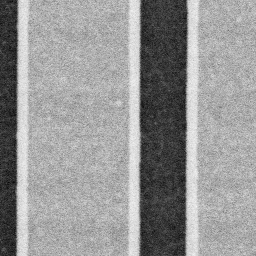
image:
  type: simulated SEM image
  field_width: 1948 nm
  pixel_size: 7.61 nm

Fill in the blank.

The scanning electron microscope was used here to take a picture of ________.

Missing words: one or a few lines or trenches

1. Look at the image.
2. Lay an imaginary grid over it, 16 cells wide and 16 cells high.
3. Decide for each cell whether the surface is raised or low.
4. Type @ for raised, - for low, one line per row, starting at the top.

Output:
--@@@@@@----@@@@
--@@@@@@----@@@@
--@@@@@@----@@@@
--@@@@@@----@@@@
--@@@@@@----@@@@
--@@@@@@----@@@@
-@@@@@@@----@@@@
-@@@@@@@----@@@@
-@@@@@@@----@@@@
-@@@@@@@----@@@@
-@@@@@@@----@@@@
-@@@@@@@----@@@@
-@@@@@@@----@@@@
-@@@@@@@----@@@@
-@@@@@@@----@@@@
-@@@@@@@----@@@@